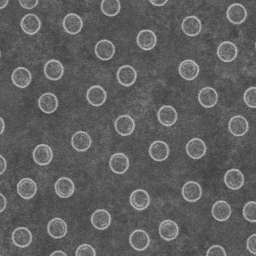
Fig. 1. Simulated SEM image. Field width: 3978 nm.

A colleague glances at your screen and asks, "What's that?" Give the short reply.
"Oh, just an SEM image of a regular array of raised bodies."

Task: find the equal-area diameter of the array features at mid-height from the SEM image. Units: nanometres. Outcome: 294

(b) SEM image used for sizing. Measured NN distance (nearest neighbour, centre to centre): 566 nanometres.